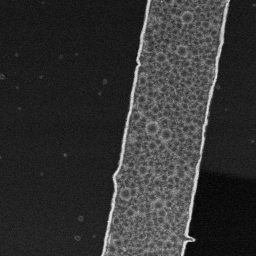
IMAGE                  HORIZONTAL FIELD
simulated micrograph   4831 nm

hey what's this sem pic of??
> one or a few lines or trenches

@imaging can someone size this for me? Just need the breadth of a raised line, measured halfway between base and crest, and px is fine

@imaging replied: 77.5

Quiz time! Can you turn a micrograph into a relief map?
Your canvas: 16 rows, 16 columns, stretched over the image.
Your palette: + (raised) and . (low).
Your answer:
.........+++++..
.........+++++..
.........+++++..
.........+++++..
.........+++++..
........+++++...
........+++++...
........+++++...
........+++++...
........+++++...
.......+++++....
.......+++++....
.......+++++....
.......+++++....
.......+++++....
.......+++++....